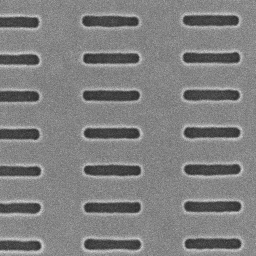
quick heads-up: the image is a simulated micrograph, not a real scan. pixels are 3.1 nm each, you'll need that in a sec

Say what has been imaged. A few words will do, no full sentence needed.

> a regular array of holes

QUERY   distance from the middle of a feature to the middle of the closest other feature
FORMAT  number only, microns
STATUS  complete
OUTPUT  0.115